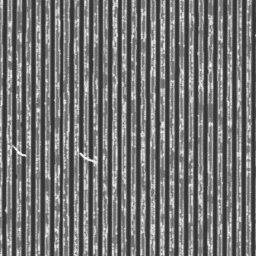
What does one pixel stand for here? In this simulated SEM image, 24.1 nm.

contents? parallel lines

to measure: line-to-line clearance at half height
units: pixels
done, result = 4.25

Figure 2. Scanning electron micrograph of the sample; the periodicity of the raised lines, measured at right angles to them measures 0.231 um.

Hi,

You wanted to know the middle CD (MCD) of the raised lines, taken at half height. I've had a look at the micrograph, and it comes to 124 nm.